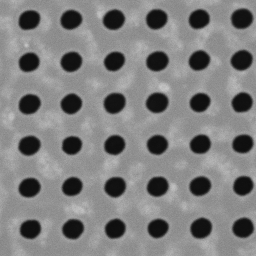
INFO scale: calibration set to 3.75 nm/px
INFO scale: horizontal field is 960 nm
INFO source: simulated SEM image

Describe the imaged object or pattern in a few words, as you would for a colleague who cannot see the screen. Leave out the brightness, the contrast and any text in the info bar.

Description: a regular array of holes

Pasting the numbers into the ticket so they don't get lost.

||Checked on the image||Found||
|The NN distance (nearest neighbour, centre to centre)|156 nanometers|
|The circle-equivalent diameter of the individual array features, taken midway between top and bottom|75.7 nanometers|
